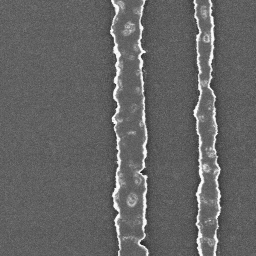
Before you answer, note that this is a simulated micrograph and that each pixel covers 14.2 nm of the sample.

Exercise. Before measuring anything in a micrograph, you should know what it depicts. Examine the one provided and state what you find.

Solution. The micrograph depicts one or a few lines or trenches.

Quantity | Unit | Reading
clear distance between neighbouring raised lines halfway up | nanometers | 772